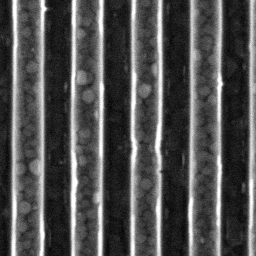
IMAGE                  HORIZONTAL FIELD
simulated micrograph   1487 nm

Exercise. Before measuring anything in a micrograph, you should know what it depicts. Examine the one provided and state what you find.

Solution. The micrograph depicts parallel lines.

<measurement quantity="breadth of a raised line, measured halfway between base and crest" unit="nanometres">174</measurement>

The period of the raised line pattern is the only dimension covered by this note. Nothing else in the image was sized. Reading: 0.343 um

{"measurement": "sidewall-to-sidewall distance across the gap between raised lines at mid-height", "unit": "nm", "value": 169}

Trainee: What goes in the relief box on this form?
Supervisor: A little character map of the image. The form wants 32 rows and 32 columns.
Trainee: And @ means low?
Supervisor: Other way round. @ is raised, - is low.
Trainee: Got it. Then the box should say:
--@@@@---@@@@----@@@----@@@@---@
--@@@@---@@@@----@@@----@@@@---@
--@@@----@@@@----@@@----@@@@---@
--@@@----@@@@----@@@----@@@@---@
--@@@----@@@@----@@@----@@@@---@
--@@@----@@@@----@@@----@@@@---@
--@@@----@@@@----@@@----@@@@---@
--@@@----@@@@----@@@----@@@@---@
--@@@----@@@@----@@@----@@@@---@
--@@@----@@@@----@@@----@@@@---@
--@@@----@@@@----@@@----@@@@---@
--@@@----@@@@----@@@----@@@@---@
--@@@----@@@@----@@@----@@@@---@
--@@@----@@@@---@@@@----@@@@---@
--@@@----@@@@---@@@@----@@@@---@
--@@@----@@@@---@@@@----@@@----@
--@@@----@@@@---@@@@----@@@----@
--@@@----@@@@---@@@@----@@@----@
--@@@----@@@@----@@@----@@@----@
--@@@----@@@@----@@@----@@@----@
--@@@----@@@@----@@@----@@@@---@
--@@@----@@@@----@@@----@@@@---@
--@@@----@@@@----@@@----@@@@---@
--@@@----@@@@----@@@----@@@@---@
--@@@----@@@@----@@@----@@@@---@
--@@@----@@@@---@@@@----@@@----@
--@@@----@@@@---@@@@----@@@----@
--@@@----@@@@---@@@@----@@@----@
--@@@----@@@@---@@@@----@@@----@
--@@@----@@@@----@@@----@@@----@
--@@@----@@@@----@@@----@@@----@
--@@@----@@@@----@@@----@@@----@